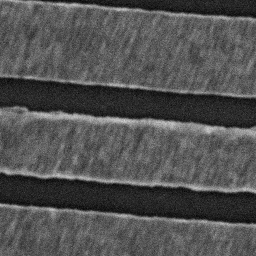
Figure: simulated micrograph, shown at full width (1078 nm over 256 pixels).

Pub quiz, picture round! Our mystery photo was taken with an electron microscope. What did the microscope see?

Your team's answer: lines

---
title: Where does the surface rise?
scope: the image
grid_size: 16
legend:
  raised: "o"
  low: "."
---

ooooooo.........
oooooooooooooooo
oooooooooooooooo
oooooooooooooooo
oooooooooooooooo
........oooooooo
................
oooooooo........
oooooooooooooooo
oooooooooooooooo
oooooooooooooooo
........oooooooo
................
oooooooo........
oooooooooooooooo
oooooooooooooooo